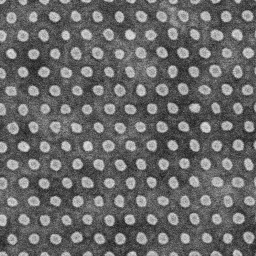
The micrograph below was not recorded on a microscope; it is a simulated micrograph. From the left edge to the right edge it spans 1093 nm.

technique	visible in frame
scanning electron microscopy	a regular array of raised bodies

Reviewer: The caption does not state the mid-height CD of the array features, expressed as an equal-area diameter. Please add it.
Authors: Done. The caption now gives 0.0447 um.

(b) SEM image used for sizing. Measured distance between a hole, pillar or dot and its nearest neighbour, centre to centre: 20.7 px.